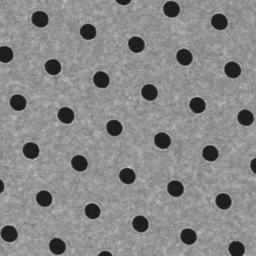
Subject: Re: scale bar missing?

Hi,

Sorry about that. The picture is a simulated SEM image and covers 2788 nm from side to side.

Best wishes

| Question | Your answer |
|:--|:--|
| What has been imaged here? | a regular array of holes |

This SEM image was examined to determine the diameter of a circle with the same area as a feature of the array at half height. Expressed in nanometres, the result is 182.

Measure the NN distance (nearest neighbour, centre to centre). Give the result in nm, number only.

540